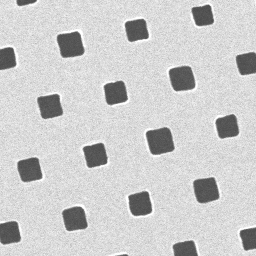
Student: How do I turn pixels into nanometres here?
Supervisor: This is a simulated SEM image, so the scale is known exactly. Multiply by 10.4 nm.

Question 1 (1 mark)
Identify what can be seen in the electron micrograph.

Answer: a regular array of holes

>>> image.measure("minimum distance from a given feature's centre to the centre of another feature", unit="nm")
682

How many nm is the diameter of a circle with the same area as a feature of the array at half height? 258